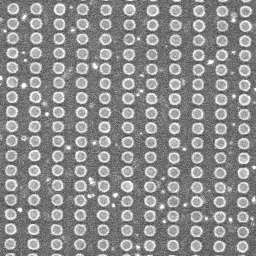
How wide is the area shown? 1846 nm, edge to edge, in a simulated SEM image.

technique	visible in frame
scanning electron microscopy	a regular array of raised bodies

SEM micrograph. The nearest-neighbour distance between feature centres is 0.105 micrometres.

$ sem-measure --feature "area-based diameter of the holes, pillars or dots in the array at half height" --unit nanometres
75.4